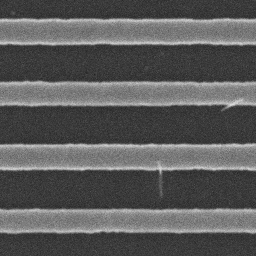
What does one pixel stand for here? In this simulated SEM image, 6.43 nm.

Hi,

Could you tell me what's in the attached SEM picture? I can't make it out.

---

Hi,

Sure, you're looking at lines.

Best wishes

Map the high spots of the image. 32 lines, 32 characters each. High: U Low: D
DDDDDDDDDDDDDDDDDDDDDDDDDDDDDDDD
DDDDDDDDDDDDDDDDDDDDDDDDDDDDDDDD
UUUUUUUUDUUUUDUUUDUUUUUUDDUUUUUD
UUUUUUUUUUUUUUUUUUUUUUUUUUUUUUUU
UUUUUUUUUUUUUUUUUUUUUUUUUUUUUUUU
UDUUUUUUUUUUDDUUUDDUUUDUDDUUUUUU
DDDDDDDDDDDDDDDDDDDDDDDDDDDDDDDD
DDDDDDDDDDDDDDDDDDDDDDDDDDDDDDDD
DDDDDDDDDDDDDDDDDDDDDDDDDDDDDDDD
DDDDDDDDDDDDDDDDDDDDDDDDDDDDDDDD
UUUUUUUUUUUUUUUUUUUUUUUUUUUUUUUU
UUUUUUUUUUUUUUUUUUUUUUUUUUUUUUUU
UUUUUUUUUUUUUUUUUUUUUUUUUUUUUUUU
DDDDDDDDDDDDDDDDDDDDDDDDDDDDDDDD
DDDDDDDDDDDDDDDDDDDDDDDDDDDDDDDD
DDDDDDDDDDDDDDDDDDDDDDDDDDDDDDDD
DDDDDDDDDDDDDDDDDDDDDDDDDDDDDDDD
DDDDDDDDDDDDDDDDDDDDDDDDDDDDDDDD
UUUUUUUUUUUUUUUUUUUUUUUUUUUUUUUU
UUUUUUUUUUUUUUUUUUUUUUUUUUUUUUUU
UUUUUUUUUUUUUUUUUUUUUUUUUUUUUUUU
DDDDDDDDDDDDDDDDDDDDDDDDDDDDDDDD
DDDDDDDDDDDDDDDDDDDDDDDDDDDDDDDD
DDDDDDDDDDDDDDDDDDDDDDDDDDDDDDDD
DDDDDDDDDDDDDDDDDDDDDDDDDDDDDDDD
DDDDDDDDDDDDDDDDDDDDDDDDDDDDDDDD
UUUUUUUUUUUUUUUUUUUUUUUUUUUUUUUU
UUUUUUUUUUUUUUUUUUUUUUUUUUUUUUUU
UUUUUUUUUUUUUUUUUUUUUUUUUUUUUUUU
DDDDDDDDDDDDDDDDDDDDDDDDDDDDDDDD
DDDDDDDDDDDDDDDDDDDDDDDDDDDDDDDD
DDDDDDDDDDDDDDDDDDDDDDDDDDDDDDDD